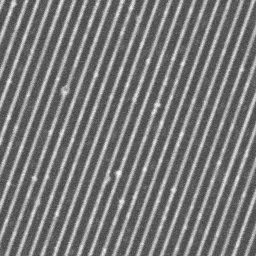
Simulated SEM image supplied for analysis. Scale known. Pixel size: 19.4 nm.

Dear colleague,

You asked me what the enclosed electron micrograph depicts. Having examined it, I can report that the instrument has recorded parallel lines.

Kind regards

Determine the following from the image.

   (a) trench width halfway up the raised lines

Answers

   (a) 166 nm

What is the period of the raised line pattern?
218 nm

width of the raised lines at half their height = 36.4 nanometers